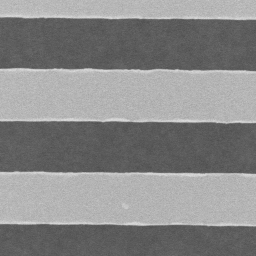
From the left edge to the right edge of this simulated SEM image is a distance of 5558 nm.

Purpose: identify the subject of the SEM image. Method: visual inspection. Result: wiring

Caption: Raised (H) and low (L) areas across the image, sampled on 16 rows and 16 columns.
HHHHHHHHHHHHHHHH
LLLLLLLLLLLLLLLL
LLLLLLLLLLLLLLLL
LLLLLLLLLLLLLLLL
HHHHHHHHHHHHHHHH
HHHHHHHHHHHHHHHH
HHHHHHHHHHHHHHHH
HHHHHHHHHHHHHHHH
LLLLLLLLLLLLLLLL
LLLLLLLLLLLLLLLL
LLLLLLLLLLLLLLLL
HHHHHHHHHHHHHHHH
HHHHHHHHHHHHHHHH
HHHHHHHHHHHHHHHH
LLLLLLLLLLLLLLLL
LLLLLLLLLLLLLLLL